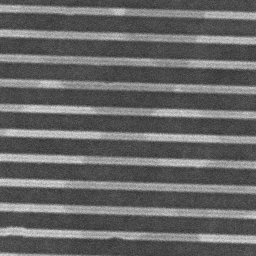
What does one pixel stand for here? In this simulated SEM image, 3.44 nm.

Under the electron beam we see parallel lines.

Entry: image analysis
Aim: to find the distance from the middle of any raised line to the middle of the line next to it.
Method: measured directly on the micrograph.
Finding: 85.4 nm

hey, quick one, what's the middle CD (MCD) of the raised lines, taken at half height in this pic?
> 21.5 nm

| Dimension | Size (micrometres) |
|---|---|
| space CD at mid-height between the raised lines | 0.0649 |